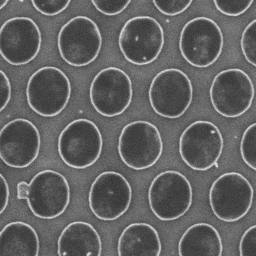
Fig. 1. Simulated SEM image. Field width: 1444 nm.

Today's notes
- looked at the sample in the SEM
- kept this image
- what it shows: a regular array of raised bodies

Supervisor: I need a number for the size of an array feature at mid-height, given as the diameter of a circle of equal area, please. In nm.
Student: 255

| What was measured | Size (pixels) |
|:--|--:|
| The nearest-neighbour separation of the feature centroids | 59.4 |